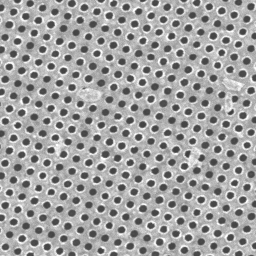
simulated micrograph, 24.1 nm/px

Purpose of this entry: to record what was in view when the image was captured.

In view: a regular array of holes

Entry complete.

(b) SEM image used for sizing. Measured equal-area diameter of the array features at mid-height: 186 nm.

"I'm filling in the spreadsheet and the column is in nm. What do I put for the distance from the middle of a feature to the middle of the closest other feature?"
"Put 313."